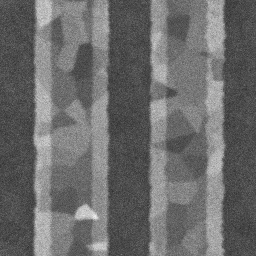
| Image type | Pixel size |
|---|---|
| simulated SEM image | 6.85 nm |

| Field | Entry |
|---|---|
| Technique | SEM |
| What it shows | one or a few lines or trenches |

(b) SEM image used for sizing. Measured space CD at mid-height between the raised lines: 392 nm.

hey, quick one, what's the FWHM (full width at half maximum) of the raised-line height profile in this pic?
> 398 nanometers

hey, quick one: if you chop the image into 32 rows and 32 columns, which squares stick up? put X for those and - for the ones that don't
-----XXXXXXXX-------XXXXXXX-----
-----XXXXXXXX-------XXXXXXX-----
-----XXXXXXXX-------XXXXXXX-----
-----XXXXXXXX-------XXXXXXX-----
-----XXXXXXXX-------XXXXXXX-----
-----XXXXXXXX-------XXXXXXX-----
-----XXXXXXXX-------XXXXXXX-----
-----XXXXXXXX-------XXXXXXX-----
-----XXXXXXX--------XXXXXXX-----
-----XXXXXXXX-------XXXXXXX-----
-----XXXXXXXX-------XXXXXXX-----
-----XXXXXXXX-------XXXXXXX-----
-----XXXXXXXX-------XXXXXXX-----
-----XXXXXXXX-------XXXXXXX-----
-----XXXXXXXX-------XXXXXXX-----
-----XXXXXXXX-------XXXXXXX-----
-----XXXXXXXX-------XXXXXXX-----
-----XXXXXXXX-------XXXXXXX-----
-----XXXXXXXX-------XXXXXXX-----
-----XXXXXXXX-------XXXXXXX-----
-----XXXXXXXX-------XXXXXXX-----
-----XXXXXXXX-------XXXXXXX-----
-----XXXXXXXX-------XXXXXXX-----
-----XXXXXXXX-------XXXXXXX-----
-----XXXXXXXX-------XXXXXXX-----
-----XXXXXXXX-------XXXXXXX-----
-----XXXXXXX--------XXXXXXX-----
-----XXXXXXXX-------XXXXXXX-----
-----XXXXXXX--------XXXXXXX-----
-----XXXXXXX--------XXXXXXX-----
-----XXXXXXX--------XXXXXXX-----
-----XXXXXXXX-------XXXXXXX-----